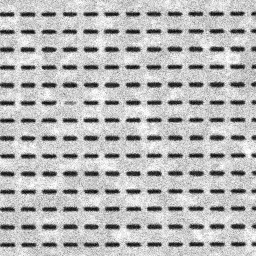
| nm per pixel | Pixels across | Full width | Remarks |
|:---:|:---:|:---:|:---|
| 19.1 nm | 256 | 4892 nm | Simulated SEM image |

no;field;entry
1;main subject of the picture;a regular array of holes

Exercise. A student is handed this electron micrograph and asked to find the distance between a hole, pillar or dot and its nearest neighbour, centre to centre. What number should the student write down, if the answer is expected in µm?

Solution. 0.335